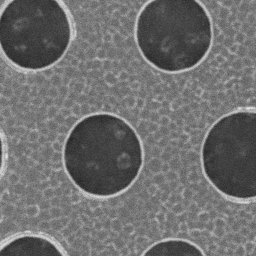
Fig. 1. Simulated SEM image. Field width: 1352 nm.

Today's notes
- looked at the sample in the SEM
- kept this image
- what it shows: holes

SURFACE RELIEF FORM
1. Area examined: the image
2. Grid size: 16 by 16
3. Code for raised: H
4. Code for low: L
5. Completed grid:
LLLLHHHHHLLLLHHH
LLLLHHHHHLLLLHHH
LLLLHHHHHLLLLHHH
LLLLHHHHHLLLLHHH
HHHHHHHHHHHHHHHH
HHHHHHHHHHHHHHHH
HHHHHHHHHHHHHHHH
HHHHHLLLHHHHHHLL
HHHHLLLLLHHHHLLL
HHHHLLLLLHHHHLLL
HHHHLLLLLHHHHLLL
HHHHHLLLHHHHHLLL
HHHHHHHHHHHHHHHH
HHHHHHHHHHHHHHHH
HHHHHHHHHHHHHHHH
LLLLHHHHHLLLHHHH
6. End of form